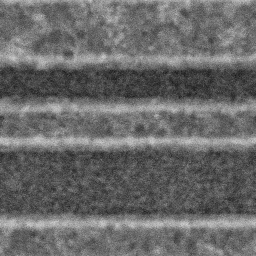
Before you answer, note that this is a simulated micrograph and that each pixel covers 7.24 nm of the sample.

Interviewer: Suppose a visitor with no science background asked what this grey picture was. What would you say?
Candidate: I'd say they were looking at one or a few lines or trenches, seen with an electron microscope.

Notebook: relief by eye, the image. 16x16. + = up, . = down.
++++++++++++++++
++++++++++++++++
++++++++++++++++
++++++++++++++++
................
................
................
++++++++++++++++
++++++++++++++++
................
................
................
................
................
++++++++++++++++
++++++++++++++++